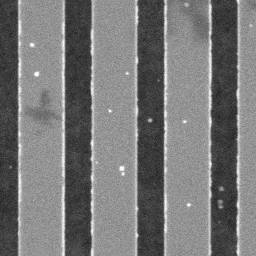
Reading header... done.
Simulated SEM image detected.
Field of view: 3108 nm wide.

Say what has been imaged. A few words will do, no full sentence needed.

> lines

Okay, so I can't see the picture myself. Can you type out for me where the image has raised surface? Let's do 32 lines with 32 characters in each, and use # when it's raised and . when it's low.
..######....#####....#####....##
..######....#####....#####....##
..######....#####....#####....##
..######...######....#####....##
..######...######....#####....##
..######...######....#####....##
..######...######....#####....##
..######....#####....#####....##
..######...######....#####....##
..######...######....#####....##
..######...######....#####....##
..######...######....#####....##
..######....#####....#####....##
..######...######....#####....##
..######....#####....#####....##
..######....#####....#####....##
..######...######....#####....##
..######...######....#####....##
..######...######....#####....##
..######...######....#####....##
..######...######....#####....##
..######...######....#####....##
..######...######....#####....##
..######...######....#####....##
..######...######....#####....##
..######...######....#####....##
..######...######....#####....##
..######...######....#####....##
..######...######....#####....##
..######...######....#####....##
..######....#####....#####....##
..######...######....#####....##